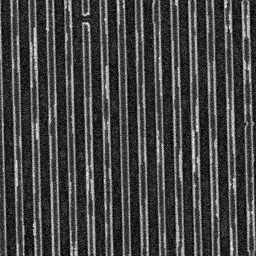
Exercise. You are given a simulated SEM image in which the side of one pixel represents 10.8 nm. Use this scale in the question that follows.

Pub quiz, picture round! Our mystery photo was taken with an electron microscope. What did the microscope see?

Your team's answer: parallel lines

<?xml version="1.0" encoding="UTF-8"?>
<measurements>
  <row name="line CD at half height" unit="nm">77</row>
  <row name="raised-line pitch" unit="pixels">17.8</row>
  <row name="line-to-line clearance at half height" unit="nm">116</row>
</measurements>